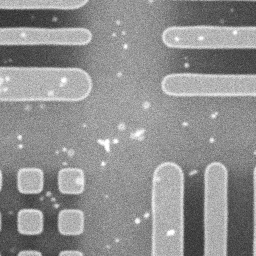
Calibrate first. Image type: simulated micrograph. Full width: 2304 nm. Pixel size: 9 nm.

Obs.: groups of lines, slits or small figures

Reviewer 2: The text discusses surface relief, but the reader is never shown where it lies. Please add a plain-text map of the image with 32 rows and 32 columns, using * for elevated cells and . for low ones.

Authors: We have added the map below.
**********......................
................................
................................
.....................***********
***********.........************
***.....***..........***********
................................
................................
................................
***********..........***********
***********.........************
***********..........***********
................................
................................
................................
................................
................................
................................
................................
................................
....................**....**....
..***...**.........****...**....
..***..***.........****...**....
..***..***.........****...**....
...................****...**....
...................****...**....
...**...**.........****...**....
..***..***.........****...**....
..***..***.........****...**....
...................****...**....
...................****...**....
...**...**.........****...**....